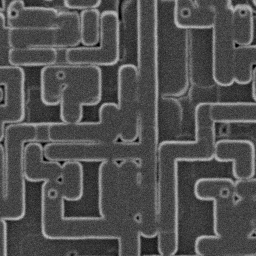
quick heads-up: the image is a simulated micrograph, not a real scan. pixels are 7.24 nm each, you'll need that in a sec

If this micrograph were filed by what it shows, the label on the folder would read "wiring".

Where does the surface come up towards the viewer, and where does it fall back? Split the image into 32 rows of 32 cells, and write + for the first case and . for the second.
..+.....++++.....++...+++++++...
.++++++...++.....++...+++++++++.
+++++++++++++++..+++..++++++++++
+++++++++++++++..+++......++++++
+++++++++++++++..+++.......+++++
+++++++++++++++..+++.......+++++
+++++++++++++++..+++.......+++++
+++++++++++++++..+++.......+++++
+++..++++++++..+++++.......+++++
+++..++++++++..+++++.......+++++
+++..++++++++..+++++.......++...
+++..++++++++..+++++............
+++..+++++++...+++++............
+++.....++...+++++++.....+++++++
+++.....++..++++++++....++++++++
++++++++++++++++++++....+++.....
++++++++++++++++++++....+++.....
++++++++++++++++++++....+++.....
++++++++++++++++++++++++++++++++
++++++++++++++++++++++++++++++++
++++++++++..++++++++++.......+++
++++++++++..++++++++++.......+++
+++.++++++..++++++++++...+++++++
+++..+++++..++++++++++..++++++++
+++..+++++..++++++++++...+++++++
+++..+++....++++++++++.....+++++
+++..+++....++++++++++.....+++++
+....+++++++++++++++++.....+++++
+....+++++++++++++++++.....+++++
+.....++++++++++++++++....++++++
+..............++...++..++++++++
+..............+++..++..++++++++